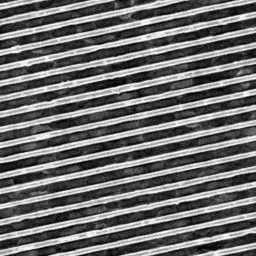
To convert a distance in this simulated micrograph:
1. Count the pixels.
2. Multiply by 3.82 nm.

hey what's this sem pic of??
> parallel lines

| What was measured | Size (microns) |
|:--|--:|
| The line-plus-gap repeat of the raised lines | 0.0576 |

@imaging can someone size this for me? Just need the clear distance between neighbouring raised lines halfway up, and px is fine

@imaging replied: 11.4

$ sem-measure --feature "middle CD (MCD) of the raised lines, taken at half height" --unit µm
0.0169